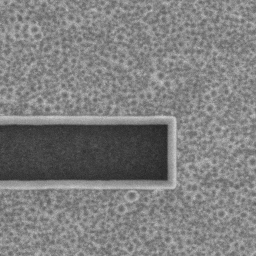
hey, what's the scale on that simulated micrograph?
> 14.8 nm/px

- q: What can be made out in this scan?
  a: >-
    one or a few lines or trenches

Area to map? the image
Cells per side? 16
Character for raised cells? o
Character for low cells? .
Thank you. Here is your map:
oooooooooooooooo
oooooooooooooooo
oooooooooooooooo
oooooooooooooooo
oooooooooooooooo
oooooooooooooooo
oooooooooooooooo
..........oooooo
...........ooooo
...........ooooo
...........ooooo
..........oooooo
oooooooooooooooo
oooooooooooooooo
oooooooooooooooo
oooooooooooooooo